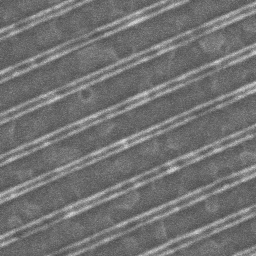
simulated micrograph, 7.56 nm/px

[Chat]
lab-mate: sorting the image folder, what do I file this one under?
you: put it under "parallel lines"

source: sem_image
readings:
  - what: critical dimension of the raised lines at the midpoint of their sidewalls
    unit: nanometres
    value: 71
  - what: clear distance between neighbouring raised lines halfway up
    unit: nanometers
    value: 214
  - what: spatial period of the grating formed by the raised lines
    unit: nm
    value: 283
